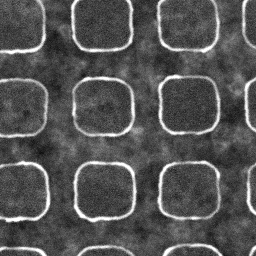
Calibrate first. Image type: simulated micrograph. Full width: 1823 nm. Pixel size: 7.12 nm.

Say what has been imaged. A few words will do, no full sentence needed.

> raised bodies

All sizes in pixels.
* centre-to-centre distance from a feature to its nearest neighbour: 84.5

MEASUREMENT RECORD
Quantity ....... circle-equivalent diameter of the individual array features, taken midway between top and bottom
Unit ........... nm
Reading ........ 453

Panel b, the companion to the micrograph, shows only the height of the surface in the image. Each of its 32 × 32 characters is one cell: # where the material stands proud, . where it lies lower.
#####....#######....#######...##
#####....########...#######...##
######...#######....#######...##
######..#########...#######...##
######..#########...#######....#
#####.....######....#######....#
.###............................
................................
................................
.....................#..........
#####.....######....#######....#
######...#######....#######....#
######...########...#######....#
######...########...#######....#
######...########...#######....#
######...########...#######....#
#####.....######.....#####......
................................
...........................#....
................................
..##.......#####.....#####......
######....#######...#######....#
######...########...#######....#
######...########...#######....#
######...########...#######....#
######...########...#######....#
######....######....#######.....
.##........#....................
................................
................................
................................
#####.....######.....######....#